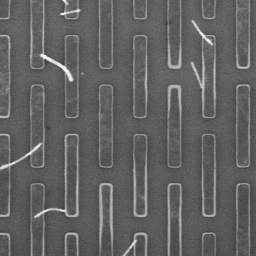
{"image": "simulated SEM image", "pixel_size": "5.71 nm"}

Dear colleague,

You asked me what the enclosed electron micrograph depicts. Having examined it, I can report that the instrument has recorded groups of lines, slits or small figures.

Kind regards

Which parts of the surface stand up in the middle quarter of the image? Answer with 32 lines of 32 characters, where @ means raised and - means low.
@@@------@@@------@@-------@@---
@@@@--------------@@------------
@@@@--------------@@------------
-@@@--------------@@------------
-@@@--------------@@------------
@@@------@@@------@@------------
@@@@-----@@@------@@------@@@---
-@@@-----@@@------@@------@@@---
-@@@-----@@@------@@------@@@---
-@@@-----@@@------@@------@@@---
-@@@-----@@@------@@------@@@---
@@@@-----@@@------@@------@@@---
@@@@-----@@@------@@------@@@---
---------@@@--------------@@@---
---------@@@--------------@@@---
---------@@@--------------@@@---
---------@@@--------------@@@---
---------@@@--------------@@@---
-@@@-----@@@------@@------@@@---
-@@@-----@@@------@@------@@@---
-@@------@@@------@@------@@@---
-@@------@@@------@@------@@@---
-@@------@@@------@@------@@@---
-@@------@@@------@@------@@@---
-@@------@@@------@@------@@@---
-@@------@@@------@@------@@@---
-@@---------------@@------------
-@@---------------@@------------
-@@---------------@@------------
-@@---------------@@------------
-@@------@@@------@@------@@@---
-@@------@@@------@@------@@@---